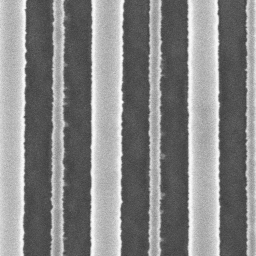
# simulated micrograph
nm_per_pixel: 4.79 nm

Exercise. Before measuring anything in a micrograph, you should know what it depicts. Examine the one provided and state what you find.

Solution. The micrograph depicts lines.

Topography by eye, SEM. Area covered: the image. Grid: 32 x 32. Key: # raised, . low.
###.........###.........###.....
###.........###.........###.....
###.........###.........###.....
###.........###.........###.....
###.........###.........###.....
###.........###.........###.....
###.........###.........###.....
###.........###.........###.....
###.........###.........###.....
###.........###.........###.....
###.........###.........###.....
###.........###.........###.....
###.........###.........###.....
###.........###.........###.....
###.........###.........###.....
###.........###.........###.....
###.........###.........###.....
###.........###.........###.....
###.........###.........###.....
###.........###.........###.....
###.........###.........###.....
###........####.........###.....
###.........###.........###.....
###........####.........###.....
###........####.........###.....
###.........###.........###.....
###........####.........###.....
###........####.........###.....
###........####.........###.....
###........####.........###.....
###........####.........###.....
###........####.........###.....